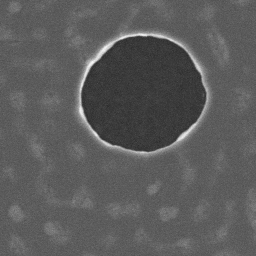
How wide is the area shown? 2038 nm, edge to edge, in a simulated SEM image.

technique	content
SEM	holes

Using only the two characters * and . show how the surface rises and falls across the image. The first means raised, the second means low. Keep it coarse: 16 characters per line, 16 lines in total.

****************
****************
*******....*****
******......****
*****........***
*****........***
*****........***
*****.......****
******.....*****
****************
****************
****************
****************
****************
****************
****************